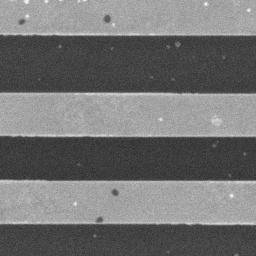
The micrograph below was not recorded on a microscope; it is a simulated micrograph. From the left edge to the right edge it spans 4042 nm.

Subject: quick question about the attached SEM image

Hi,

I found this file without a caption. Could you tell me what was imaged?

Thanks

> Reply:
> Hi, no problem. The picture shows lines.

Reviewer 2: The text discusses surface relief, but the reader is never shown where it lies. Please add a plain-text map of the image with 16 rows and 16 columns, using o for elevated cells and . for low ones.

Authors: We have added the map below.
oooooooooooooooo
oooooooooooooooo
................
................
................
................
oooooooooooooooo
oooooooooooooooo
oooooooooooooooo
................
................
oooooooooooooooo
oooooooooooooooo
oooooooooooooooo
................
................